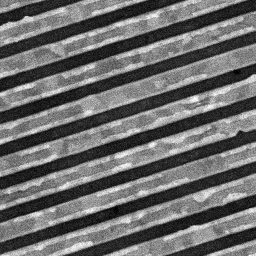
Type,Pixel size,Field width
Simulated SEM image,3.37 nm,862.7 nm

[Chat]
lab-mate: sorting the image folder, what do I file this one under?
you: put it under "parallel lines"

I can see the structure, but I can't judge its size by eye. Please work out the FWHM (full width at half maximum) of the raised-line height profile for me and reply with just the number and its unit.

0.0582 micrometres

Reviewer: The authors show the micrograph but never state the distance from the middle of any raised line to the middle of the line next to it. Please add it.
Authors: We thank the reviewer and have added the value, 105 nm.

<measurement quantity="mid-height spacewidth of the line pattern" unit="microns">0.0466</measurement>